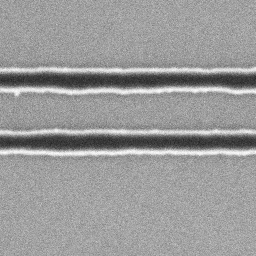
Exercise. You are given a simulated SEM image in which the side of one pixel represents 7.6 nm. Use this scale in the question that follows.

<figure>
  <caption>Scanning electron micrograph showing lines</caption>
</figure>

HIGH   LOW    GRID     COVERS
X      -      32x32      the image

--------------------------------
--------------------------------
--------------------------------
--------------------------------
--------------------------------
--------------------------------
--------------------------------
--------------------------------
--------------------------------
XXXXXXXXXXXXXXXXXXXXXXXXXXXXXXXX
XXXXXXXXXXXXXXXXXXXXXXXXXXXXXXXX
-------XXXXXX-XXXXXX--------XXXX
--------------------------------
--------------------------------
--------------------------------
--------------------------------
XX--XXXXXXXXXXXXXXXXXXXXXXXXXXXX
XXXXXXXXXXXXXXXXXXXXXXXXXXXXXXXX
XXXXXXXXXXXXXXXXXXXXXXXXXXXXXXXX
--------------------------------
--------------------------------
--------------------------------
--------------------------------
--------------------------------
--------------------------------
--------------------------------
--------------------------------
--------------------------------
--------------------------------
--------------------------------
--------------------------------
--------------------------------